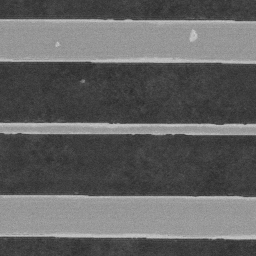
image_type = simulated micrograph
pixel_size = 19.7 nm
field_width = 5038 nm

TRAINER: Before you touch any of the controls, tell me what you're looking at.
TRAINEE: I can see lines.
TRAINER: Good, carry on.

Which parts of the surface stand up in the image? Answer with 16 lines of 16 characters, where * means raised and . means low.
................
****************
****************
****************
................
................
................
................
................
................
................
................
****************
****************
****************
................